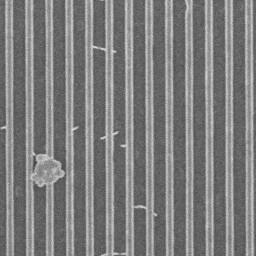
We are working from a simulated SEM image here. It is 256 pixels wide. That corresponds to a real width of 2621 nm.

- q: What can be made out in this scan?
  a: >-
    parallel lines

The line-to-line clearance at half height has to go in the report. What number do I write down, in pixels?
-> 14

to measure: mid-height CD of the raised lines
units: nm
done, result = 66.6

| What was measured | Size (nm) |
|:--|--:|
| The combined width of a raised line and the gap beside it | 205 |